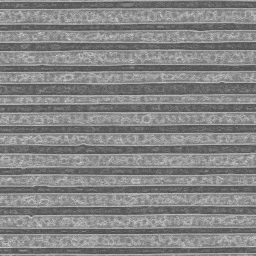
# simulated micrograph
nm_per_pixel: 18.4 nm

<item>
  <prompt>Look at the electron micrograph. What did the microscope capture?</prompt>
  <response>parallel lines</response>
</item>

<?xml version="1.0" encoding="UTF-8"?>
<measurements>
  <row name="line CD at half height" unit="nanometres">235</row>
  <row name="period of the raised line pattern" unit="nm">376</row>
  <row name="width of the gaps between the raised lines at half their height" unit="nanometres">150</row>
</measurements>